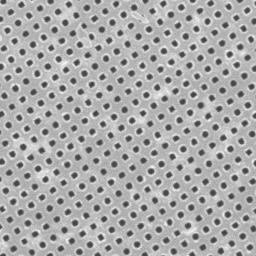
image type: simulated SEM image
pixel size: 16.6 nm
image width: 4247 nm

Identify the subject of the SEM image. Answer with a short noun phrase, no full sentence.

a regular array of holes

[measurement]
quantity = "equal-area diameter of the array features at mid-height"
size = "117 nm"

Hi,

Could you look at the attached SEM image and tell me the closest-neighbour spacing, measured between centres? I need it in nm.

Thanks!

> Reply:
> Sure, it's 214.